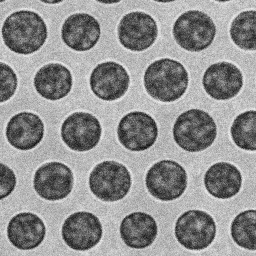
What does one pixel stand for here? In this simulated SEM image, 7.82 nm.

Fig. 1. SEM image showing a regular array of holes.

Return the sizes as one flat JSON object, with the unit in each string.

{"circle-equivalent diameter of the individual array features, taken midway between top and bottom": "323 nanometers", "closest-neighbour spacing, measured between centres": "441 nm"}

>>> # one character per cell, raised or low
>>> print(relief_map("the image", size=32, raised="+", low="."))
++++++.++++++.++++++++++++++++++
++..++++++++++++..+++++..+++++..
+....+++....+++....+++.....++...
......++.....++.....++.....++...
......++.....++.....++.....++...
+.....++....+++....+++....+++...
++..++++++++++++++++++++++++++++
++++++++++++++++++++..++++++++++
.++++...++++....++.....+++....++
..++.....++.....++......+.....++
..++.....++.....++......+.....++
..+++....+++....++.....+++....++
.+++++.++++++.+++++...+++++.++++
++++++++++++++++++++++++++++++++
++...++++...+++....+++....++++..
+....+++.....++.....++.....++...
+.....++.....++.....++.....++...
+....+++.....++....+++.....++...
++..+++++...++++...++++...++++..
++++++++++++++++++++++++++++++++
.++++...++++...++++...+++++..+++
..++.....++.....++.....+++....++
..++.....++......+......+.....++
..++.....++.....++.....+++....++
.++++...++++....+++....+++...+++
++++++++++++++++++++++++++++++++
+++.+++++..++++++++++++...++++..
+....+++....+++....+++.....++...
+.....++.....++.....++.....++...
+.....++.....++.....++.....++...
+....+++....++++...+++....++++..
++++++++++++++++++++++++++++++++